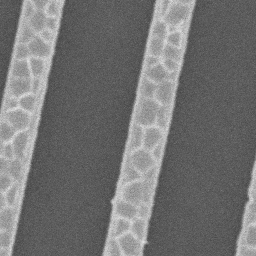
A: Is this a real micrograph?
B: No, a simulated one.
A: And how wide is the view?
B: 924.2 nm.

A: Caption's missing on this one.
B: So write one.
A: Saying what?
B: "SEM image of one or a few lines or trenches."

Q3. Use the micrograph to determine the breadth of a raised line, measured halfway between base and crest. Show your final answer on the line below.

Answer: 133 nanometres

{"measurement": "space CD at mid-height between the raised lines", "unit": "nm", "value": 331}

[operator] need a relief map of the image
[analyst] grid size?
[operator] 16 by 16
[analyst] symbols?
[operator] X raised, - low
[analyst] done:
-XXX------XX----
-XXX------XX----
-XX------XXX----
-XX------XX-----
-XX------XX-----
XXX------XX-----
XXX-----XXX-----
XX------XXX-----
XX------XX------
XX------XX------
XX------XX------
XX-----XXX------
X------XXX------
X------XX------X
X------XX------X
X------XX------X